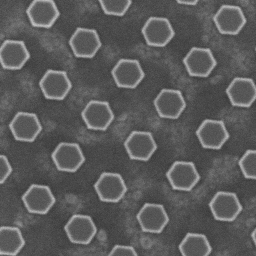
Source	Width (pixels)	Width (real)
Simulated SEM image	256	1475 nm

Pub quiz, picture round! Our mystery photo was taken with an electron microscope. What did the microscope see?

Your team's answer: a regular array of raised bodies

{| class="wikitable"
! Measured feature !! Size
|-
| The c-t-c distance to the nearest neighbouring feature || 296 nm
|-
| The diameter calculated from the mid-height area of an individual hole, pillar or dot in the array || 168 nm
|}